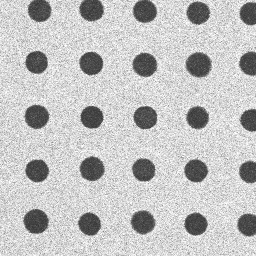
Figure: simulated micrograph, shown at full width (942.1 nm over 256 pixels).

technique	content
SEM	a regular array of holes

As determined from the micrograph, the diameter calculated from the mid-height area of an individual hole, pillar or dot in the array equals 0.0838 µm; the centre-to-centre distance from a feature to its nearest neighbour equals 0.191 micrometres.